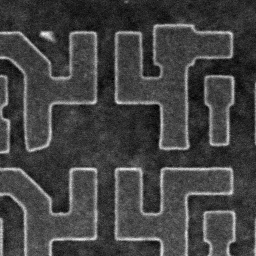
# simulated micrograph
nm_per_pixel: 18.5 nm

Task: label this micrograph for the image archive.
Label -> wiring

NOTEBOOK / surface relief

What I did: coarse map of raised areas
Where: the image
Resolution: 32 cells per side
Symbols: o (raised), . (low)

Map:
................................
................................
................................
...................ooooo........
ooo......ooo..oooo.oooooooooo...
oooo.....ooo..oooo.oooooooooo...
ooooo....ooo..oooo.oooooooooo...
.ooooo...ooo..oooo.oooooo.......
..oooo...ooo..oooo..oooo........
...oooo.oooo..oooo..ooo...oo....
o..ooooooooo..ooooooooo...ooo...
o..ooooooooo..ooooooooo...ooo...
o..ooooooooo..ooooooooo...ooo...
...ooo..............ooo...ooo...
...ooo..............ooo...ooo...
o..ooo..............ooo...ooo...
o..ooo..............ooo...ooo...
o..ooo..............ooo...ooo...
o..oo...............ooo.........
................................
................................
ooo......ooo..oooo..ooooooooo...
oooo.....ooo..oooo..ooooooooo...
ooooo....ooo..oooo..ooooooooo...
.ooooo...ooo..oooo..oooo........
..oooo...ooo..oooo..ooo.........
...oooo.oooo..oooo..ooo...ooo...
...ooooooooo..ooooooooo...ooo...
...ooooooooo..ooooooooo...ooo...
...ooooooooo..ooooooooo...ooo...
...ooo..............ooo...ooo...
...ooo..............ooo...ooo...